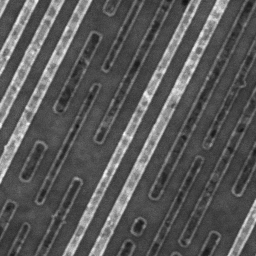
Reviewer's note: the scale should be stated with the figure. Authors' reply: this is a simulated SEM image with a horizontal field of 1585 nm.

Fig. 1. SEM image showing parallel lines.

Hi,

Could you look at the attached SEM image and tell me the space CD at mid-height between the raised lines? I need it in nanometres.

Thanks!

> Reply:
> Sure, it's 98.2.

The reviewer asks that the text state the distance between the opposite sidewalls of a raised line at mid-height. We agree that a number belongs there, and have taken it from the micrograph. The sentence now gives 54.6 nanometres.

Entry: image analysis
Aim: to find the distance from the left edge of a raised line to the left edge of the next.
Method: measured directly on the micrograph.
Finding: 153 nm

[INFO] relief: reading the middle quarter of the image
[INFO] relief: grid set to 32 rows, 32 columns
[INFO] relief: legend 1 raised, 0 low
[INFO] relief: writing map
00011100001100000110000011000011
00111000001000001100000110000011
00111000000000001100000110000111
01110000000000011000001100000110
01110000000000011000001100001110
11100001100000110000011000001100
11100001100000110000011000011100
11000011000001100000110000011000
11000011000001100000110000111000
10000110000011000001100000110000
10000110000011000001100001110000
00001100000110000011000001100000
00001100000110000011000011100001
00011000001100000110000011000001
00011000001100000110000111000011
00110000011000001100000110000011
00110000011000001100001110000111
01100000110000011000001100000111
01100000110000011000011100001110
11000000100000110000011000001110
11000000000000110000111000011100
10000000000001100000110000011100
10000000000001100001110000111000
00000000000011000001100000111000
00000000000011000011100001110000
00000000000110000011000001110000
00000000000110000111000011100000
00000000001100000110000011100001
00000000001100001110000111000001
00110000011000001100000111000011
00110000011000011100001110000011
01100000110000011000001110000110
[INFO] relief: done